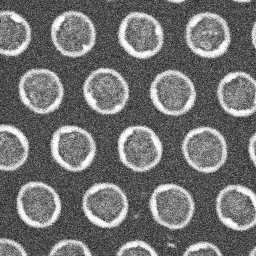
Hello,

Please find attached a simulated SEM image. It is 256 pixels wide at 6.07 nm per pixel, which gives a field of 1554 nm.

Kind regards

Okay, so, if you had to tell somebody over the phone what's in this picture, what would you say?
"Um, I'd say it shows a regular array of raised bodies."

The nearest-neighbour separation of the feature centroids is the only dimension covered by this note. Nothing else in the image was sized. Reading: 396 nm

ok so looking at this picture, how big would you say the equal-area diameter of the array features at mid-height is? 250 nanometres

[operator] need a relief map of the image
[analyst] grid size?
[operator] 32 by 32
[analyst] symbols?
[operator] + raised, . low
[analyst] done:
................................
................................
+++....++++.....+++.....++++....
+++....+++++...+++++....++++....
++++...+++++...+++++....++++....
+++....++++....+++++....++++....
++......+++.....+++......+++....
................................
................................
...++++.....+++.....+++......++.
...++++....+++++...+++++....++++
...+++++...+++++...+++++....++++
...+++++...+++++...+++++....++++
....+++.....+++.....+++.....++++
................................
................................
++.....+++......+++.....+++.....
+++....++++....+++++...+++++....
+++....+++++...+++++...+++++...+
+++....++++....+++++...+++++....
++......+++.....+++.....++++....
................................
................................
...+++......+++.....++.......+..
..+++++....++++....+++++...+++++
..+++++....+++++...+++++...+++++
..+++++....+++++...+++++...+++++
...++++....++++.....+++.....++++
.............................++.
................................
++......++......++..............
+++....++++....++++....++++.....